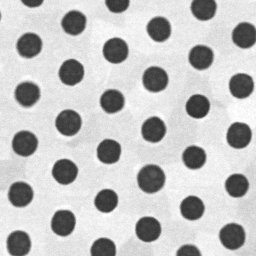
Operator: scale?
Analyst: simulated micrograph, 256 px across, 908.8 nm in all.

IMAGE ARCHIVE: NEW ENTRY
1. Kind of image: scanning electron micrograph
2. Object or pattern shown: a regular array of holes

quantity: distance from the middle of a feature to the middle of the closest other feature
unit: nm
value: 172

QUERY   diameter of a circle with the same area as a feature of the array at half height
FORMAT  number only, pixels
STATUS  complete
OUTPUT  26.7